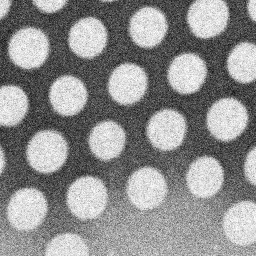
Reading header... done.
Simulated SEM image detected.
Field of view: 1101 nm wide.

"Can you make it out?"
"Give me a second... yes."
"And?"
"a regular array of raised bodies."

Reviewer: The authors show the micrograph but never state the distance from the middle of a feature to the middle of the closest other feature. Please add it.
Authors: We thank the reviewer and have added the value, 60 px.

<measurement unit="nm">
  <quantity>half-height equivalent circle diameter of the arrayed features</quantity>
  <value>172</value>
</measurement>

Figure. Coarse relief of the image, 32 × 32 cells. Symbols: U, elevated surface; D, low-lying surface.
UDDDUUUUDDDDDDDDDDDDDDDDUUUUDDDU
UDDDDDUDDDDDDDDDDUUUDDDDUUUUUDDU
DDDDDDDDDDUUDDDDUUUUUDDUUUUUDDDD
DDDUDDDDDUUUUDDDUUUUUDDDUUUUDDDD
DDUUUUDDDUUUUDDDUUUUUDDDUUUDDDDD
DUUUUUDDDUUUUDDDDUUUDDDDDDDDDDUU
DUUUUUDDDUUUUDDDDDDDDDDDDDDDDUUU
DUUUUUDDDDDDDDDDDDDDDDUUUDDDUUUU
DDDUDDDDDDDDDDDUUUDDDUUUUUDDUUUU
DDDDDDDDUDDDDDUUUUDDDUUUUUDDDUUU
DDDDDDDUUUDDDUUUUUDDDUUUUDDDDDDD
UUUDDDUUUUUDDDUUUUDDDDUUDDDDDDDD
UUUUDDUUUUUDDDUUUDDDDDDDDDDUUUDD
UUUUDDDUUUDDDDDDDDDDDDDDDDUUUUUD
UUUDDDDDDDDDDDDDDDDUUUUDDDUUUUUD
UUDDDDDDDDDDUUUDDDDUUUUDDDUUUUUD
DDDDDUUDDDDUUUUUDDUUUUUDDDUUUUDD
DDDDUUUUDDDUUUUUDDDUUUUDDDDDUDDD
DDDUUUUUDDDUUUUDDDDDUUDDDDDDDDDD
UDDUUUUUDDDDUUUDDDDDDDDDDDDDDDDU
UDDDUUUUDDDDDDDDDDDDDDDDUUUDDDDU
DDDDDUUDDDDDDDDDDUUUDDDUUUUUDDDU
DDDDDDDDDDUUDDDDUUUUUDDUUUUUDDDU
DDDUDDDDDUUUUDDDUUUUUDDDUUUDDDDD
DDUUUDDDUUUUUDDDUUUUDDDDDDDDDDDD
DUUUUUDDDUUUUDDDDUUUDDDDDDDDDDUU
DUUUUUDDDUUUDDDDDDDDDDDDDDDDDUUU
DUUUUDDDDDDDDDDDDDDDDDDDDDDDUUUU
DDUUDDDDDDDDDDDDDDDDDDDDDDDDUUUU
DDDDDDDUUUDDDDDDDDDDDDDDDDDDDUUU
DDDDDDUUUUUDDDDDDDDDDDDDDDDDDDUD
DDDDDDUUUUUDDDDDDDDDDDDDDDDDDDDD